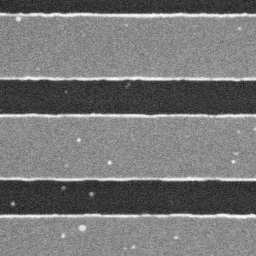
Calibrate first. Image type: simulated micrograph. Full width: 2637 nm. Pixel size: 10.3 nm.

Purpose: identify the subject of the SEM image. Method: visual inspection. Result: lines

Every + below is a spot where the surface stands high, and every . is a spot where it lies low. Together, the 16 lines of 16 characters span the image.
................
++++++++++++++++
++++++++++++++++
++++++++++++++++
++++++++++++++++
................
................
++++++++++++++++
++++++++++++++++
++++++++++++++++
++++++++++++++++
................
................
++++++++++++++++
++++++++++++++++
++++++++++++++++